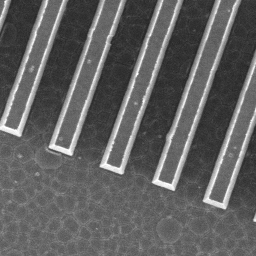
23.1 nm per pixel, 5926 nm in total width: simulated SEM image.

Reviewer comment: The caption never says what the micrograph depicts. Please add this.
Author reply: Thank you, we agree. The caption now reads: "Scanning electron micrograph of parallel lines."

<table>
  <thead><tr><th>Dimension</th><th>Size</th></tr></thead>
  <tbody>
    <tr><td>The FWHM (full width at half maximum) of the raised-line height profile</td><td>486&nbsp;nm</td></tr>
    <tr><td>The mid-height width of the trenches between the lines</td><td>770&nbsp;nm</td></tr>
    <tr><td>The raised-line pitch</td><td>1240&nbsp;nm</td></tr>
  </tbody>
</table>